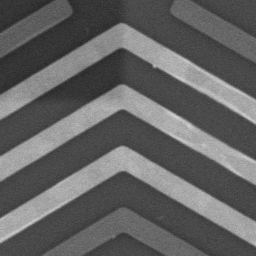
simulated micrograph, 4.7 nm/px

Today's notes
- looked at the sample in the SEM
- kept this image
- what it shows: groups of lines, slits or small figures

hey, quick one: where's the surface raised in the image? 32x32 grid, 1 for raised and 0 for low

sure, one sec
00000011100000000000001100000000
00000111100000000000011111000000
00011111000000000000000111110000
01111100000000110000000011111100
11110000000011111100000000111110
11100000000111111111000000001111
10000000011111001111100000000011
00000001111100000011111000000001
00000011111000000000111110000000
00001111100000000000001111000000
00111110000000000000000011110000
01111100000000111000000000111100
11110000000011111110000000001111
11000000001111111111000000000111
10000000011111000111110000000001
00000001111100000001111000000000
00000111110000000000011110000000
00001111100000000000000111000000
00111110000000010000000001110000
11111000000001111100000000011100
11110000000111111110000000001111
11000000001111101111100000000111
00000000111110000011111000000001
00000011111000000001111110000000
00000111110000000000011111000000
00011111000000000000000111110000
01111100000000111000000001111100
11110000000001111100000000111111
11100000000111111111000000001111
10000000011111000111110000000011
00000000111100000011111100000000
00000011111000000000111110000000